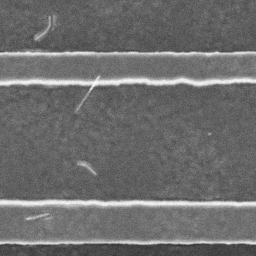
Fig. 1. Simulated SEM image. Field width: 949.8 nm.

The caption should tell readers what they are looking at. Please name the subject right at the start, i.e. lines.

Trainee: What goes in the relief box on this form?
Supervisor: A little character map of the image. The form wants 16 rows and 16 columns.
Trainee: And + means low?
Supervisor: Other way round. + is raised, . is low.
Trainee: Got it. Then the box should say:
................
................
................
++++++++++++++++
++++++++++++++++
................
................
................
................
................
................
................
................
++++++++++++++++
++++++++++++++++
................